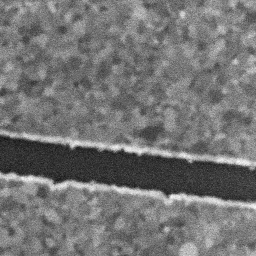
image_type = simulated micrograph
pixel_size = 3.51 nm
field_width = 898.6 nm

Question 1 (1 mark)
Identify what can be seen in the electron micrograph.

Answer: one or a few lines or trenches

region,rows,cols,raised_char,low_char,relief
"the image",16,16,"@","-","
@@@@@@@@@@@@@@@@
@@@@@@@@@@@@@@@@
@@@@@@@@@@@@@@@@
@@@@@@@@@@@@@@@@
@@@@@@@@@@@@@@@@
@@@@@@@@@@@@@@@@
@@@@@@@@@@@@@@@@
@@@@@@@@@@@@@@@@
-@@@@@@@@@@@@@@@
----------@@@@@@
----------------
@@@-@-----------
@@@@@@@@@@@@@---
@@@@@@@@@@@@@@@@
@@@@@@@@@@@@@@@@
@@@@@@@@@@@@@@@@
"